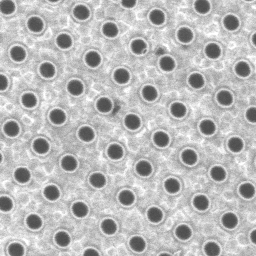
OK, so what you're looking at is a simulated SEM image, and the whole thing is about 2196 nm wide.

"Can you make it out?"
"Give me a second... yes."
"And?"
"a regular array of raised bodies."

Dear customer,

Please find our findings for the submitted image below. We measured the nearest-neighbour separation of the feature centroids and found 284 nm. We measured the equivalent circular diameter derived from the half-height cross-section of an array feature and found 0.161 µm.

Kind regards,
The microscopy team